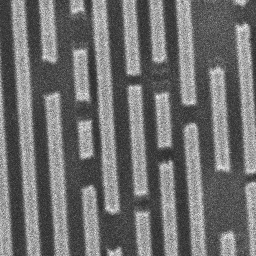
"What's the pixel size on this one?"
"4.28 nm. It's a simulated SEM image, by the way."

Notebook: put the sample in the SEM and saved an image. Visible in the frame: parallel lines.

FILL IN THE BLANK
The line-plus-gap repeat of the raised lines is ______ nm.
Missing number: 118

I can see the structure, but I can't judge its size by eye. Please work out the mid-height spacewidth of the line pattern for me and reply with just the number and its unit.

58.7 nm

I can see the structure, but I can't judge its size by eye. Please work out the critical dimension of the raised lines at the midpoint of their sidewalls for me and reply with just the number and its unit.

14.6 pixels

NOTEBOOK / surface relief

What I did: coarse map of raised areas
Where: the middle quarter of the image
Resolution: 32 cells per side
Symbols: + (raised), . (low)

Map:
..++++..+++.....+++..........+++
...+++..++++....+++..........+++
...+++..++++....+++..........+++
...+++..++++.................+++
...+++..++++.................+++
...+++..++++....+++..........+++
...+++..++++....+++..........+++
...+++..++++....+++.....++...+++
...+++..++++....++++...+++....++
.........+++....++++...+++....++
.........+++....++++...+++......
.........+++....++++...+++......
.........+++....++++...+++......
.........+++....++++...+++......
....+++..+++....++++...++++.....
...++++..+++....++++...++++...++
...++++..+++.....+++...++++...++
....+++..++++....+++...++++...++
....+++..++++....+++...++++...++
....+++..++++....+++...++++...++
....+++..++++....+++...++++...++
....+++..++++....+++..........++
....+++..++++....+++..........++
....+....++++....+++..........++
.........++++....++++.....+....+
..........+++....++++...+++....+
..........+++....++++...+++....+
..........+++....++++...+++....+
..........+++....++++...+++....+
..........+++....++++...+++....+
......+...+++....++++...++++...+
....++++..++++...++++...++++...+